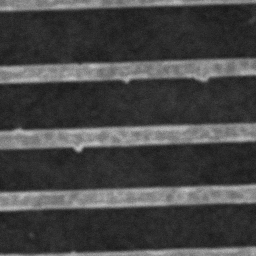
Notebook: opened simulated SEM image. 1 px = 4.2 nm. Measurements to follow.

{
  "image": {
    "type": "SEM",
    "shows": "one or a few lines or trenches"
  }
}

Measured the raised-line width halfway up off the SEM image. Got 0.0671 µm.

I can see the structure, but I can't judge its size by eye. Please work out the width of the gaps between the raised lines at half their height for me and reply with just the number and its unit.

197 nanometers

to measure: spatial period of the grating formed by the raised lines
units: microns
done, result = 0.266